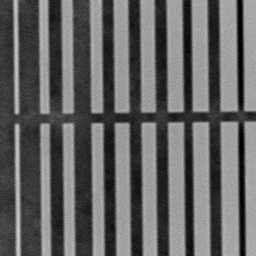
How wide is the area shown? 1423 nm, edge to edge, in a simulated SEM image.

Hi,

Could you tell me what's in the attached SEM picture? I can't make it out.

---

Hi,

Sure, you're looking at groups of lines, slits or small figures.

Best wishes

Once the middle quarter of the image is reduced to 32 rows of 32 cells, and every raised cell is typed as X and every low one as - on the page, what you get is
XX-----XX----XXX----XXX---XXXX--
XX-----XXX---XXX----XXX---XXXX--
XX-----XXX---XXX----XXX---XXXX--
XX-----XXX---XXX----XXX---XXXX--
XX-----XXX---XXX----XXX---XXXX--
XX-----XXX---XXX----XXX---XXXX--
XX-----XXX---XXX----XXX---XXXX--
XX-----XXX---XXX----XXX---XXXX--
XX-----XXX---XXX----XXX---XXXX--
XX-----XXX---XXX----XXX---XXXX--
XX-----XXX---XXX----XXX---XXXX--
XX-----XXX---XXX----XXX---XXXX--
--------------------------------
--------------------------------
--------------------------------
XX-----XXX---XXX----XXX---XXXX--
XX-----XXX---XXX----XXX---XXXX--
XX-----XXX---XXX----XXX---XXXX--
XX-----XXX---XXX----XXX---XXXX--
XX-----XXX---XXX----XXX---XXXX--
XX-----XXX---XXX----XXX---XXXX--
XX-----XXX---XXX----XXX---XXXX--
XX-----XXX---XXX----XXX---XXXX--
XX-----XXX---XXX----XXX---XXXX--
XX-----XXX---XXX----XXX---XXXX--
XX-----XXX---XXX----XXX---XXXX--
XX-----XXX---XXX----XXX---XXXX--
XX-----XXX---XXX----XXX---XXXX--
XX-----XXX---XXX----XXX---XXXX--
XX-----XXX---XXX----XXX---XXXX--
XX-----XXX---XXX----XXX---XXXX--
XX-----XXX---XXX----XXX---XXXX--